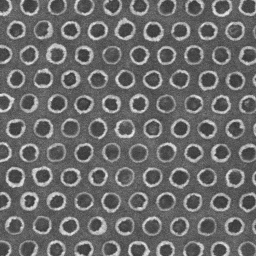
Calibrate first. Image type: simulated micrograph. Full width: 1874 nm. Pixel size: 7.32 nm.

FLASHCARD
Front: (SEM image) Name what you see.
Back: a regular array of raised bodies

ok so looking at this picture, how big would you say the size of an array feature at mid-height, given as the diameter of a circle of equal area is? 135 nanometers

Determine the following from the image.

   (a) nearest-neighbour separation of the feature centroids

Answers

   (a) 198 nanometers